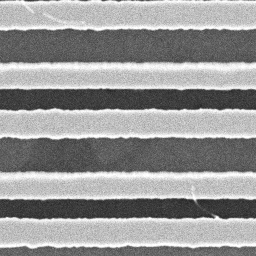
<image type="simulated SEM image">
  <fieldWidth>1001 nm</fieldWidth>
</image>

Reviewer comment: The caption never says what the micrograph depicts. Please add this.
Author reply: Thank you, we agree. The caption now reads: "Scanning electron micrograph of lines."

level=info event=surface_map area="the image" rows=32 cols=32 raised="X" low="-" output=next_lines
XXXXXXXXXXXXXXXXXXXXXXXXXXXXXXXX
XXXXXXXXXXXXXXXXXXXXXXXXXXXXXXXX
XXXXXXXXXXXXXXXXXXXXXXXXXXXXXXXX
XXXXXXXXXXXXXXXXXXXXXXXXXXXXXXXX
--------------------------------
--------------------------------
--------------------------------
--------------------------------
XXXXXXXXXXXXXXXXXXXXXXXXXXXXXXXX
XXXXXXXXXXXXXXXXXXXXXXXXXXXXXXXX
XXXXXXXXXXXXXXXXXXXXXXXXXXXXXXXX
--------------------------------
--------------------------------
--------------------------------
XXXXXXXXXXXXXXXXXXXXXXXXXXXXXXXX
XXXXXXXXXXXXXXXXXXXXXXXXXXXXXXXX
XXXXXXXXXXXXXXXXXXXXXXXXXXXXXXXX
--------------------------------
--------------------------------
--------------------------------
--------------------------------
------------X-----X----------X--
XXXXXXXXXXXXXXXXXXXXXXXXXXXXXXXX
XXXXXXXXXXXXXXXXXXXXXXXXXXXXXXXX
XXXXXXXXXXXXXXXXXXXXXXXXXXXXXXXX
--------------------------------
--------------------------------
XXXXXXXXXXXXXXXXXXXXXXXXXXXXXXXX
XXXXXXXXXXXXXXXXXXXXXXXXXXXXXXXX
XXXXXXXXXXXXXXXXXXXXXXXXXXXXXXXX
XXXXXXXXXXXXXXXXXXXXXXXXXXXXXXXX
--------------------------------